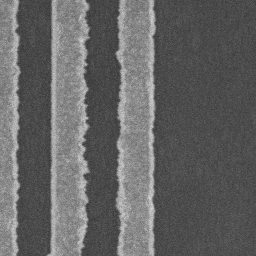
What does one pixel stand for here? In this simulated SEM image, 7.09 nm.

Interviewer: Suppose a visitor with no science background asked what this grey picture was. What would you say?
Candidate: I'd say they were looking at one or a few lines or trenches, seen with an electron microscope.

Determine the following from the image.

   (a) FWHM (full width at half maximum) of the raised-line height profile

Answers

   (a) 213 nm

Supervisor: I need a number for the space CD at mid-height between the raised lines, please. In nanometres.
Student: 271